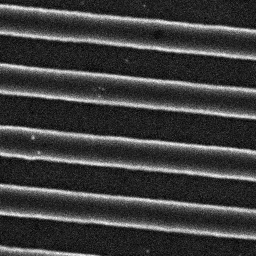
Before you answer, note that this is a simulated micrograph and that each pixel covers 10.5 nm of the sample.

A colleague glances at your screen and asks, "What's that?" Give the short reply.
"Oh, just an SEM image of lines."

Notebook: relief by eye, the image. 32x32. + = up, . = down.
................................
++++++++........................
++++++++++++++++++..............
++++++++++++++++++++++++++++....
....++++++++++++++++++++++++++++
..............++++++++++++++++++
.......................+++++++++
................................
++++............................
++++++++++++++..................
++++++++++++++++++++++++........
++++++++++++++++++++++++++++++++
.........+++++++++++++++++++++++
....................++++++++++++
.............................+++
................................
++++++..........................
+++++++++++++++++...............
+++++++++++++++++++++++++++.....
.+++++++++++++++++++++++++++++++
............++++++++++++++++++++
.......................+++++++++
...............................+
++++............................
+++++++++++++...................
+++++++++++++++++++++++.........
++++++++++++++++++++++++++++++++
.........+++++++++++++++++++++++
...................+++++++++++++
.............................+++
................................
++++++..........................